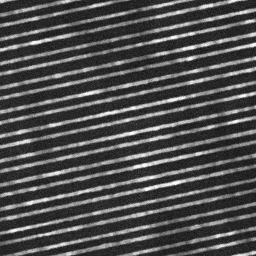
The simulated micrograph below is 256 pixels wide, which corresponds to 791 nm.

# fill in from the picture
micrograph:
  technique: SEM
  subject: parallel lines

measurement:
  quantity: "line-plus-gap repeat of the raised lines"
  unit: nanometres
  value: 36.6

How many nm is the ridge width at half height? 8.3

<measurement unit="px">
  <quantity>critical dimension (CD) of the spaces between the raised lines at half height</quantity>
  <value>8.19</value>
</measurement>